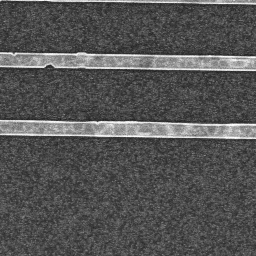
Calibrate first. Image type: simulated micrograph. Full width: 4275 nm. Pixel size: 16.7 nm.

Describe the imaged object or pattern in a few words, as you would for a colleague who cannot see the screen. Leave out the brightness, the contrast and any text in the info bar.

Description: one or a few lines or trenches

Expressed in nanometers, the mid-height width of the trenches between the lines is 897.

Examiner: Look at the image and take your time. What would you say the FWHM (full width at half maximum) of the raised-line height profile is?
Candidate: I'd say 219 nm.